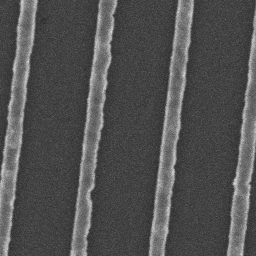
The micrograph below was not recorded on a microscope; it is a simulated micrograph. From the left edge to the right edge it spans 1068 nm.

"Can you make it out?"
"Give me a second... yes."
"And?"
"one or a few lines or trenches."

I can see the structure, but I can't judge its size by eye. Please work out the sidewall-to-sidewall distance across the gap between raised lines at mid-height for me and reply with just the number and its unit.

0.264 µm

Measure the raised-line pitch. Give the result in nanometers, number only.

325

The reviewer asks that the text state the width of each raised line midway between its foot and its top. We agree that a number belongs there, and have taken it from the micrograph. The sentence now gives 61.1 nm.